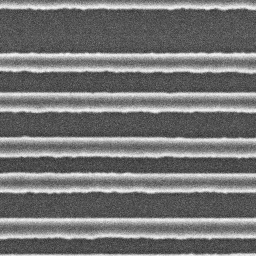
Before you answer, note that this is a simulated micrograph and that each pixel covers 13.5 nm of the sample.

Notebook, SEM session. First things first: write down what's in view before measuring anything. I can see lines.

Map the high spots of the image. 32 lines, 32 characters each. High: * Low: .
********************************
................................
................................
................................
................................
................................
................................
********************************
********************************
................................
................................
................................
********************************
********************************
................................
................................
................................
********************************
********************************
*****.****...*******************
................................
................................
********************************
********************************
................................
................................
................................
********************************
********************************
********************************
................................
................................